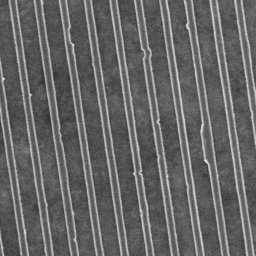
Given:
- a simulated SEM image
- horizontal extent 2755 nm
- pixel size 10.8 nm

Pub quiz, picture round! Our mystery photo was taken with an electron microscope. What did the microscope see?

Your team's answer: parallel lines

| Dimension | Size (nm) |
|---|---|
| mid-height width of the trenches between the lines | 186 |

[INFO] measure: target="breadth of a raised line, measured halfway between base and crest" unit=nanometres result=78.5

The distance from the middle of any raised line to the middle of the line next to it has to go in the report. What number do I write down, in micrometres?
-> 0.267